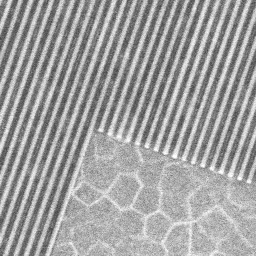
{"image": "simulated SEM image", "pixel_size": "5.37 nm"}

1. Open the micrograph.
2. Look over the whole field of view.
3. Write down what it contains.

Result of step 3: parallel lines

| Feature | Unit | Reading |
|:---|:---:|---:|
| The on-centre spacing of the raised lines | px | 9.83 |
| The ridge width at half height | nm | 20.3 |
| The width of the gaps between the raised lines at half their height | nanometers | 35.5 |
